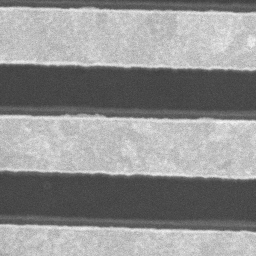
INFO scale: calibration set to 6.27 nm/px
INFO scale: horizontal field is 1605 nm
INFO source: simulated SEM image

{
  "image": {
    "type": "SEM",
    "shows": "lines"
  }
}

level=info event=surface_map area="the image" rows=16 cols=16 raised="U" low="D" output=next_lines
UUDDDUDDDDDDDDDD
UUUUUUUUUUUUUUUU
UUUUUUUUUUUUUUUU
UUUUUUUUUUUUUUUU
DDDDDDDDDDDDDDDD
DDDDDDDDDDDDDDDD
DDDDDDDDDDDDDDDD
UUUUUUUUUUUUUUDD
UUUUUUUUUUUUUUUU
UUUUUUUUUUUUUUUU
UUUUUUUUUUUUUUUU
DDDDDDDDDDDDDDDD
DDDDDDDDDDDDDDDD
DDDDDDDDDDDDDDDD
UUUUUUUUUUUUUUUU
UUUUUUUUUUUUUUUU